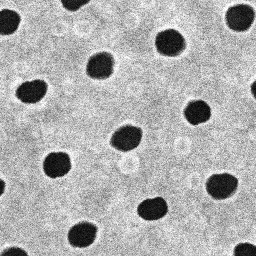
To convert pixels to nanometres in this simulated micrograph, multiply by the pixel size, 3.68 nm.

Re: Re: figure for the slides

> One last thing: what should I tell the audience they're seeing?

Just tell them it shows a regular array of holes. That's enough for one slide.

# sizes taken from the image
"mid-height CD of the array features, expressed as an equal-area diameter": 101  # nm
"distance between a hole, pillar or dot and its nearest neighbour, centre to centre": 272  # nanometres